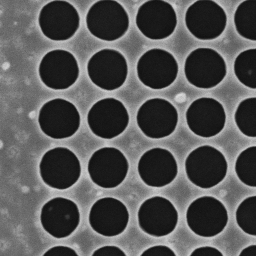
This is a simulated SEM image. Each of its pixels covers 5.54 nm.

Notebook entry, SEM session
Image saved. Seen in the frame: a regular array of holes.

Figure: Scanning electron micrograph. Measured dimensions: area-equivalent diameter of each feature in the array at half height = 40.2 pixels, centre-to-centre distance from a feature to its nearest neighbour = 268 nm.